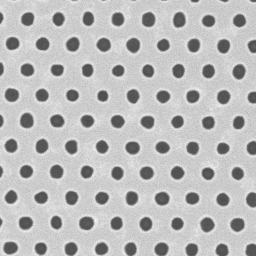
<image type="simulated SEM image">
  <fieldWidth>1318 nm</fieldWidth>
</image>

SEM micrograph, a regular array of holes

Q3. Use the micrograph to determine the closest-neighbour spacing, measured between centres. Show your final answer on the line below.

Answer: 149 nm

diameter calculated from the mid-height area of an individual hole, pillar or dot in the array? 66.9 nanometres